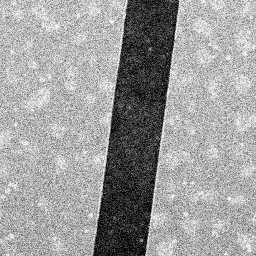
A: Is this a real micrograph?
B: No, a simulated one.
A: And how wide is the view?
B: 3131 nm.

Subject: one or a few lines or trenches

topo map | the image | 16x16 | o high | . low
oooooooo...ooooo
oooooooo...ooooo
oooooooo...ooooo
ooooooo....ooooo
ooooooo....ooooo
ooooooo....ooooo
ooooooo...oooooo
ooooooo...oooooo
ooooooo...oooooo
ooooooo...oooooo
ooooooo...oooooo
oooooo....oooooo
oooooo....oooooo
oooooo...ooooooo
oooooo...ooooooo
oooooo...ooooooo